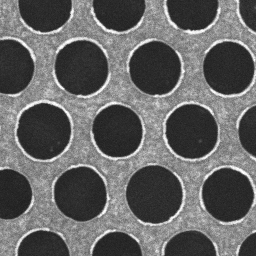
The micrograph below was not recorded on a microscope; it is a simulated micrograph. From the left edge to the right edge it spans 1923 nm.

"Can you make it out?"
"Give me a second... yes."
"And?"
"a regular array of holes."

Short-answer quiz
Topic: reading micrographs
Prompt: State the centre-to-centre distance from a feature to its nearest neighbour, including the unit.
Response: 0.548 microns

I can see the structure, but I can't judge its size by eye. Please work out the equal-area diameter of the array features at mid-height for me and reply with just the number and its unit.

404 nanometres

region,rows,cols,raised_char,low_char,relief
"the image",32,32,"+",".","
++.......+++......+++......+++..
++.......+++......+++......+++..
+++......+++......+++......+++..
++++...++++++...+++++++...+++++.
++++++++++++++++++++++++++++++++
...++++++...++++++...++++++...++
....+++......++++.....++++.....+
....+++......+++......+++.......
....+++.......++.......++.......
....+++......+++.......+++......
....+++......++++.....++++.....+
...++++++...++++++...++++++...++
++++++++++++++++++++++++++++++++
++++...++++++...++++++....+++++.
+++.....++++.....++++......+++..
++.......+++......+++......+++..
++.......+++......+++......+++..
++.......+++......+++......+++..
+++.....++++.....++++......+++..
++++...+++++++..+++++++..+++++++
++++++++++++++++++++++++++++++++
..++++++....+++++....++++++...++
...++++......+++......++++.....+
....+++......+++.......++.......
....+++......+++.......++.......
....+++......+++.......+++......
...+++++.....++++.....++++.....+
+++++++++..+++++++...++++++...++
++++++++++++++++++++++++++++++++
+++....++++++...++++++....+++++.
+++.....++++.....++++......+++..
++.......+++......++.......+++..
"